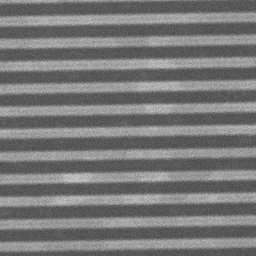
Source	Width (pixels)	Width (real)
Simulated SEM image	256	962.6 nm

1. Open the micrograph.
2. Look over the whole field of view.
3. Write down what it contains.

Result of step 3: parallel lines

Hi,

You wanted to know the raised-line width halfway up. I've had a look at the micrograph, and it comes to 27.7 nanometers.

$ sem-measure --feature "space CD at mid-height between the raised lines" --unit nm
55.9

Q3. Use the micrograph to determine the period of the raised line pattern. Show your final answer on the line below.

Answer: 84.9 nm